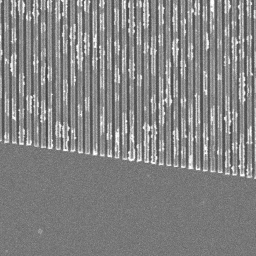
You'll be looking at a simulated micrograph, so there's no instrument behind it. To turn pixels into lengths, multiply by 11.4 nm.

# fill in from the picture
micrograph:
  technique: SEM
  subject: parallel lines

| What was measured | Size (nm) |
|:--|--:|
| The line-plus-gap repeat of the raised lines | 83.6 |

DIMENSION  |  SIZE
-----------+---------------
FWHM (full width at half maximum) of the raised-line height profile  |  49.8 nm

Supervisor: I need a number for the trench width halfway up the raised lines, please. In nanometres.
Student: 39.8